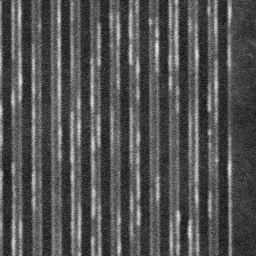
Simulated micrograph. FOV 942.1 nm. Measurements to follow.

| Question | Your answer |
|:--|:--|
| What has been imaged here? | parallel lines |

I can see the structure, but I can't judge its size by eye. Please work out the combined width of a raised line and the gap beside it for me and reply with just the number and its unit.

72.2 nanometers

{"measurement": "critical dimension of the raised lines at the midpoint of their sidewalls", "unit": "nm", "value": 30.8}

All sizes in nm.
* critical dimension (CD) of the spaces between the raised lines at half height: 40.4